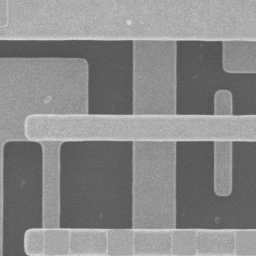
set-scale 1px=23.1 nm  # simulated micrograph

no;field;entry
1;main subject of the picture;wiring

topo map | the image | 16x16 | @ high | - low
@@@@@@@@@@@@@@@@
@@@@@@@@@@@@@@@@
------------@@@@
----------------
----------------
----------------
----------------
--@@@@@@@@@@@@@@
--@@@@@@@@@@@@@@
----------------
----------------
----------------
----------------
----------------
--@@@@@@@@@@@@@@
--@@@@@@@@@@@@@@